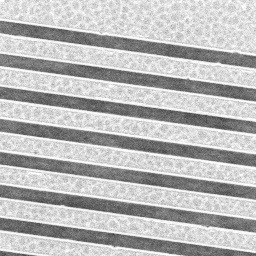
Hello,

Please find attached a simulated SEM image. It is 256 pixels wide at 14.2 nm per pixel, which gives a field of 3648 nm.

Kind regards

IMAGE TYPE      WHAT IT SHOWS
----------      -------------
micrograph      parallel lines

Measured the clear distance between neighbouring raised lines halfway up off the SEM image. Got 199 nanometers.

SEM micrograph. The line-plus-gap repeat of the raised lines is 463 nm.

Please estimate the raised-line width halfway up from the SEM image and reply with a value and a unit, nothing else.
266 nm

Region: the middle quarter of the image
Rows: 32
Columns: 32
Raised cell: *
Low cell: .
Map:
........************************
................****************
.......................*********
***...........................**
***********.....................
******************..............
*************************.......
********************************
.......*************************
..............******************
.....................***********
***.........................****
*********.......................
****************................
***********************.........
********************************
......**************************
..............******************
.....................***********
**..........................****
*********.......................
****************................
***********************.........
******************************..
.....***************************
............********************
...................*************
..........................******
*******.........................
**************..................
*********************...........
*****************************...